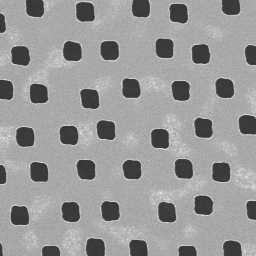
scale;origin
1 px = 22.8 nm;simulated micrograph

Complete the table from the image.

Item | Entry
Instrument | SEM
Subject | a regular array of holes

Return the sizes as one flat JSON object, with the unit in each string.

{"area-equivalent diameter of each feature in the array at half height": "460 nm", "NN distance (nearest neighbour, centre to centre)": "862 nm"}